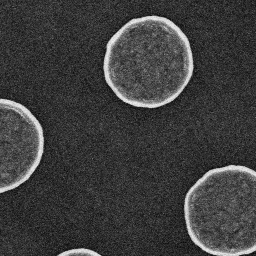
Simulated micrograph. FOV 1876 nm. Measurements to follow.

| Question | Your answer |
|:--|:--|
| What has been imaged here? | raised bodies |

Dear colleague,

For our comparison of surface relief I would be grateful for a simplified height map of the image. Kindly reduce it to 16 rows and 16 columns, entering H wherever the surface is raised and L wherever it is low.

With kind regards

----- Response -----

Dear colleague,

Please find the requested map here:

LLLLLLLLLLLLLLLL
LLLLLLLLHHHLLLLL
LLLLLLLHHHHHLLLL
LLLLLLLHHHHHLLLL
LLLLLLLHHHHHLLLL
LLLLLLLHHHHLLLLL
HLLLLLLLHHLLLLLL
HHLLLLLLLLLLLLLL
HHHLLLLLLLLLLLLL
HHHLLLLLLLLLLLLL
HHLLLLLLLLLLLLHL
HLLLLLLLLLLLHHHH
LLLLLLLLLLLLHHHH
LLLLLLLLLLLLHHHH
LLLLLLLLLLLLHHHH
LLLLLLLLLLLLLHHH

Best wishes